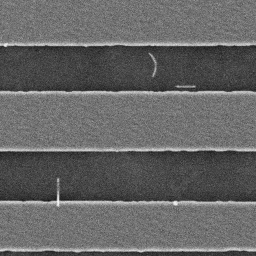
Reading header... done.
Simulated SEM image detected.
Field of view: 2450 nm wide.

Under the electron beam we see lines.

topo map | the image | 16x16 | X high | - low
XXXXXXXXXXXXXXXX
XXXXXXXXXXXXXXXX
XXXXXXXXXXXXXXXX
----------------
----------------
----------------
XXXXXXXXXXXXXXXX
XXXXXXXXXXXXXXXX
XXXXXXXXXXXXXXXX
----------------
----------------
----------------
----------------
XXXXXXXXXXXXXXXX
XXXXXXXXXXXXXXXX
XXXXXXXXXXXXXXXX